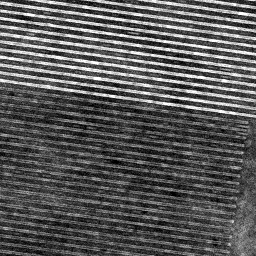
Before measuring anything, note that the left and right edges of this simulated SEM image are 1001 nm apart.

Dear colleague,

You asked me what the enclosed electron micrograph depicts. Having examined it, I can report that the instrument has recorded parallel lines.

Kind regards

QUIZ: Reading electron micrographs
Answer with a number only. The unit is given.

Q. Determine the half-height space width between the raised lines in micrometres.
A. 0.0203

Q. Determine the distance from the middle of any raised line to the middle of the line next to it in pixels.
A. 7.7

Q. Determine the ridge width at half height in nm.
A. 10.2